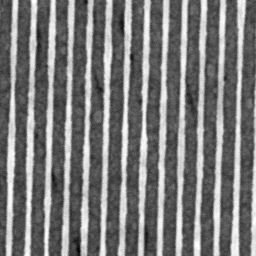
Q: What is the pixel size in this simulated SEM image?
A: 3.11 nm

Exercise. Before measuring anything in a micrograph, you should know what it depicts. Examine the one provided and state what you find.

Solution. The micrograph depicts parallel lines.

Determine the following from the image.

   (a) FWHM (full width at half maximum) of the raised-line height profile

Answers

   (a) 12 nm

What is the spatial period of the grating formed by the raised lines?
58.5 nm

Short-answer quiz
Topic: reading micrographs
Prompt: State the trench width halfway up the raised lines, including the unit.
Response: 0.0462 um